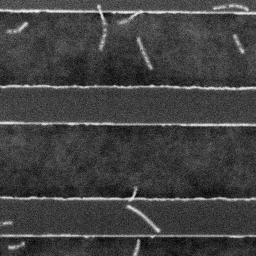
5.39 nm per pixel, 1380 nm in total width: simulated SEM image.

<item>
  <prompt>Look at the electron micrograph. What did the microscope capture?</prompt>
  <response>lines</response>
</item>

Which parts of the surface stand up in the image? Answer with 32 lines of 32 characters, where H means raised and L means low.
HHHHHHHHHHHHHHHHHHHHHHHHHHHHHHHH
LLLLLLLLLLLLHLHHHHHHHHHHHHHHHHHH
LLLLLLLLLLLLLLLLLLLLLLLLLLLLLLLL
LLLLLLLLLLLLLLLLLLLLLLLLLLLLLLLL
LLLLLLLLLLLLLLLLLLLLLLLLLLLLLLLL
LLLLLLLLLLLLLLLLLLLLLLLLLLLLLLLL
LLLLLLLLLLLLLLLLLLLLLLLLLLLLLLLL
LLLLLLLLLLLLLLLLLLLLLLLLLLLLLLLL
LLLLLLLLLLLLLLLLLLLLLLLLLLLLLLLL
LLLLLLLLLLLLLLLLLLLLLLLLLLLLLLLL
LLLLLLLLLLLLLLLLLLLLLLLLLLLLLLLL
HHHHHHHHHHHHHHHHHHHHHHHHHHHHHHHH
HHHHHHHHHHHHHHHHHHHHHHHHHHHHHHHH
HHHHHHHHHHHHHHHHHHHHHHHHHHHHHHHH
HHHHHHHHHHHHHHHHHHHHHHHHHHHHHHHH
LLLLLLLLHHLLHHHHHHHHHHHHHHHHHHHH
LLLLLLLLLLLLLLLLLLLLLLLLLLLLLLLL
LLLLLLLLLLLLLLLLLLLLLLLLLLLLLLLL
LLLLLLLLLLLLLLLLLLLLLLLLLLLLLLLL
LLLLLLLLLLLLLLLLLLLLLLLLLLLLLLLL
LLLLLLLLLLLLLLLLLLLLLLLLLLLLLLLL
LLLLLLLLLLLLLLLLLLLLLLLLLLLLLLLL
LLLLLLLLLLLLLLLLLLLLLLLLLLLLLLLL
LLLLLLLLLLLLLLLLLLLLLLLLLLLLLLLL
LLLLLLLLLLLLLLLLLLLLLLLLLLLLLLLL
HHHHHHHHHHHHHHHHHHHHHHHHHHHHHHHH
HHHHHHHHHHHHHHHHHHHHHHHHHHHHHHHH
HHHHHHHHHHHHHHHHHHHHHHHHHHHHHHHH
HHHHHHHHHHHHHHHHHHHHHHHHHHHHHHHH
LLLLLLLLLLHLLLLLLLHHLLLLLLLLLHHL
LLLLLLLLLLLLLLLLLLLLLLLLLLLLLLLL
LLLLLLLLLLLLLLLLLLLLLLLLLLLLLLLL